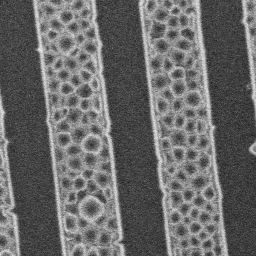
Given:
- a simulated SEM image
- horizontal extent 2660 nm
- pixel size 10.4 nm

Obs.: one or a few lines or trenches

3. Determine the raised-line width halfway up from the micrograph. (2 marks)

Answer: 0.59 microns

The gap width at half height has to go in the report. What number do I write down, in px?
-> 46.7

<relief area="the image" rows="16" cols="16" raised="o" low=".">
..oooo...ooo...o
..oooo...ooo...o
...ooo...oooo...
...ooo...oooo...
...ooo...oooo...
...ooo...oooo...
...oooo..oooo...
...oooo...ooo...
...oooo...ooo...
...oooo...ooo...
...oooo...ooo...
o...ooo...oooo..
o...ooo...oooo..
o...ooo...oooo..
o...ooo...oooo..
o...oooo...ooo..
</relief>